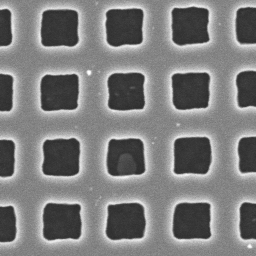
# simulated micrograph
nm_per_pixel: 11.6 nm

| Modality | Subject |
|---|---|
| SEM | a regular array of holes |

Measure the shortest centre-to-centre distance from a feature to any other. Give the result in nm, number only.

746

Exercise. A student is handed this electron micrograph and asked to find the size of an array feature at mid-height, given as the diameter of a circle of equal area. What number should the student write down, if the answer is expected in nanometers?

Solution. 478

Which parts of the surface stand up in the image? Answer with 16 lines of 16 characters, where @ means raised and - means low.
@@@@@@@@@@@--@@-
-@@--@@--@@--@@-
-@@--@@--@@--@@-
@@@@@@@@@@@@@@@@
@@@@@@@@@@@@@@@-
-@@--@@--@@--@@-
-@@--@@--@@--@@-
@@@@@@@@@@@@@@@@
@@@@@@@@@@@@@@@@
-@@--@@--@@--@@-
-@@--@@--@@--@@-
@@@@@@@@@@@@@@@@
@@@@@@@@@@@@@@@@
-@@--@@--@@--@@-
-@@--@@--@@--@@-
@@@@@@@@@@@@@@@@